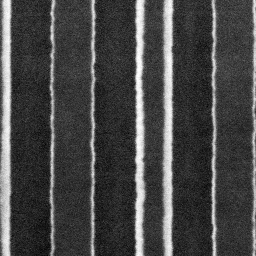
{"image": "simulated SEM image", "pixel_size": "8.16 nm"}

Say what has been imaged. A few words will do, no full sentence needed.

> lines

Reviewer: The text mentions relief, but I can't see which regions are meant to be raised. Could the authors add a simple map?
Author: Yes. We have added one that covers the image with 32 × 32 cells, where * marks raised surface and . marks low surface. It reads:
*......*****.....****......*****
*.....******.....****......*****
*......*****.....****......*****
*.....******.....****......*****
*.....******.....****......*****
*......*****.....****......*****
*......*****.....****......*****
*......*****.....****......*****
*.....******.....****......*****
*.....******.....****......*****
*.....******.....****......*****
*.....******.....****......*****
*......*****.....****......*****
*......*****.....****......*****
*.....******.....****......*****
*.....******.....****......*****
*......*****.....****......*****
*......*****.....****......*****
*.....******.....****......*****
*.....******.....****......*****
*.....******.....****......*****
*.....******.....****......*****
*.....******.....****......*****
*.....******.....****......*****
*.....******.....****......*****
*.....******.....****......*****
*.....******.....****......*****
*.....******.....****......*****
*......*****.....****......*****
*.....******.....****......*****
*......*****.....****......*****
*.....******.....****......*****